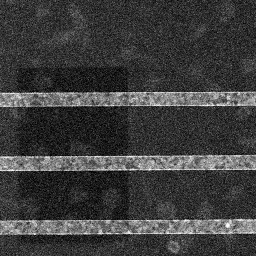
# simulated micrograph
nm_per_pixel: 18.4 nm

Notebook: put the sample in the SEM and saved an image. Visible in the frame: one or a few lines or trenches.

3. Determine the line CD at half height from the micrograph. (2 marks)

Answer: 248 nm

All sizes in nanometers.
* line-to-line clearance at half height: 925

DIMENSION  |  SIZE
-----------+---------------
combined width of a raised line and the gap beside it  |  1170 nm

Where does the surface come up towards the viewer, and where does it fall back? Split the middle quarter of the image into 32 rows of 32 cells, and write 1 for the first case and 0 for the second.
00000000000000000000000000000000
00000000000000000000000000000000
00000000000000000000000000000000
00000000000000000000000000000000
00000000000000000000000000000000
00000000000000000000000000000000
00000000000000000000000000000000
11111111111111111111111111111111
11111111111111111111111111111111
11111111111111111111111111111111
00000000000000000000000000000000
00000000000000000000000000000000
00000000000000000000000000000000
00000000000000000000000000000000
00000000000000000000000000000000
00000000000000000000000000000000
00000000000000000000000000000000
00000000000000000000000000000000
00000000000000000000000000000000
00000000000000000000000000000000
00000000000000000000000000000000
00000000000000000000000000000000
00000000000000000000000000000000
11111111111111111111111111111111
11111111111111111111111111111111
11111111111111111111111111111111
00000000000000000000000000000000
00000000000000000000000000000000
00000000000000000000000000000000
00000000000000000000000000000000
00000000000000000000000000000000
00000000000000000000000000000000